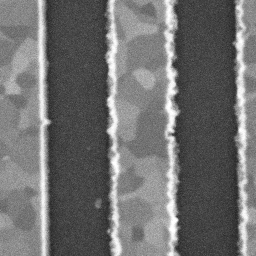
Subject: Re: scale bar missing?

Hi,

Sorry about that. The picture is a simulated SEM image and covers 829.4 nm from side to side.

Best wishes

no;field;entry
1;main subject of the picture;one or a few lines or trenches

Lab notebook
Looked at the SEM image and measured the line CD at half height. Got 57 px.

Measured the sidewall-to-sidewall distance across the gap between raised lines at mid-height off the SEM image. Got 232 nm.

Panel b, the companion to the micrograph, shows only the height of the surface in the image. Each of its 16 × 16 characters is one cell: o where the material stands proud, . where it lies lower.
ooo....oooo....o
ooo....oooo....o
ooo....oooo....o
ooo....oooo....o
ooo....oooo....o
ooo....oooo....o
ooo....oooo....o
ooo....oooo....o
ooo....oooo....o
ooo....oooo....o
ooo....oooo....o
ooo....oooo....o
ooo....oooo....o
ooo....oooo....o
ooo....oooo....o
ooo....oooo....o